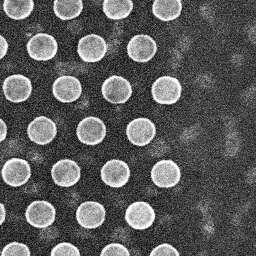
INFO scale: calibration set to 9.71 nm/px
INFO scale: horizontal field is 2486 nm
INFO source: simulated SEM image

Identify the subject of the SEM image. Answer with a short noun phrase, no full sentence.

a regular array of raised bodies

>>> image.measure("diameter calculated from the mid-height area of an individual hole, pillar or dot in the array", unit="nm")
259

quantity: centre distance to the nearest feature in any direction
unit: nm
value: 468